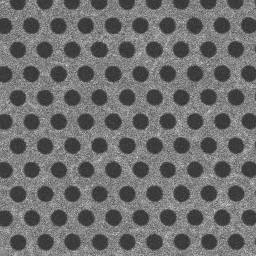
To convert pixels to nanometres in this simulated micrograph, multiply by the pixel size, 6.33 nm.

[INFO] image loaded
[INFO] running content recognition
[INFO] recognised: a regular array of holes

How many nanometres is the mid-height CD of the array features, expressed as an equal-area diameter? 107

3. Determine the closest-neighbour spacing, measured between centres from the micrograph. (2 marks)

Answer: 171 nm